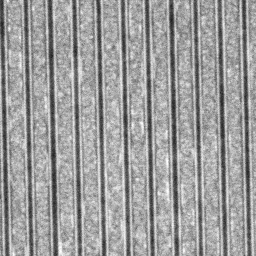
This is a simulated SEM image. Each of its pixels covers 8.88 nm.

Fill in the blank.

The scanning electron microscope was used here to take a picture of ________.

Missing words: parallel lines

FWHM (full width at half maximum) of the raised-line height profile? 6.87 pixels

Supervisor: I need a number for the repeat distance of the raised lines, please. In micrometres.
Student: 0.215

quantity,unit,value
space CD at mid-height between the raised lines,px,17.1